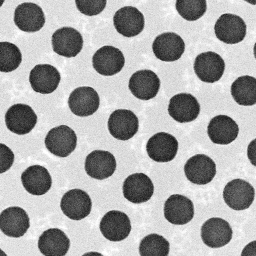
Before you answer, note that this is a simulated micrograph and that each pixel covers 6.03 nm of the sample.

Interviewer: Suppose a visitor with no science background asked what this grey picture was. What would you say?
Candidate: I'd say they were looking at a regular array of holes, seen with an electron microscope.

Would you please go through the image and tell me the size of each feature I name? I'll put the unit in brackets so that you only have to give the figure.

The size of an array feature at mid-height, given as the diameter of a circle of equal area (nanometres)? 191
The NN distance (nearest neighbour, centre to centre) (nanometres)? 267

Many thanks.